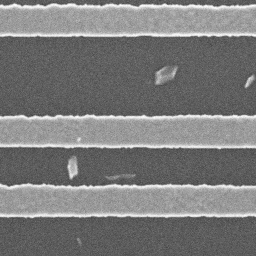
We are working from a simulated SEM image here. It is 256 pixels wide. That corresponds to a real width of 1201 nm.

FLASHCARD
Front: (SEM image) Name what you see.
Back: lines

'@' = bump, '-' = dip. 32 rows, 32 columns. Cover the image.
--------------------------------
@@@@@@@@@@@@@@@@@@@@@@@@@@@@@@@@
@@@@@@@@@@@@@@@@@@@@@@@@@@@@@@@@
@@@@@@@@@@@@@@@@@@@@@@@@@@@@@@@@
@@@@@@@@@@@@@@@@@@-@@@@@@@@@@@-@
--------------------------------
--------------------------------
--------------------------------
--------------------------------
--------------------@-----------
--------------------------------
--------------------------------
--------------------------------
--------------------------------
--@----@@-@@-@--------@@@@@@-@@@
@@@@@@@@@@@@@@@@@@@@@@@@@@@@@@@@
@@@@@@@@@@@@@@@@@@@@@@@@@@@@@@@@
@@@@@@@@@@@@@@@@@@@@@@@@@@@@@@@@
---------------------------@----
--------------------------------
--------------------------------
--------------------------------
--------------------------------
@@@@@@@@@@@@@@@@@@@@@@@@@@@@@@@@
@@@@@@@@@@@@@@@@@@@@@@@@@@@@@@@@
@@@@@@@@@@@@@@@@@@@@@@@@@@@@@@@@
@@@@@@@@@@@@@@@@@@@@@@@@@@@@@@@@
--------------------------------
--------------------------------
--------------------------------
--------------------------------
--------------------------------